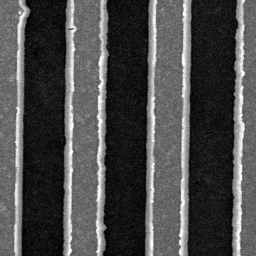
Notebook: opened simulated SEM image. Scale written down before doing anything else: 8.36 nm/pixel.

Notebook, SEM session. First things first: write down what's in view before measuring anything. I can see one or a few lines or trenches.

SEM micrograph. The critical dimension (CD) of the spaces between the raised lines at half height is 403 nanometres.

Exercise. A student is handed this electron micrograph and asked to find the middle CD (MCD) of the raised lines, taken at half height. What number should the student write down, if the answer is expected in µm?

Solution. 0.294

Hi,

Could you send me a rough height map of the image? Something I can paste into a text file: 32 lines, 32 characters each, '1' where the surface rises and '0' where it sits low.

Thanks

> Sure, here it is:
11100000011110000001111000000011
11100000011110000001111000000011
11100000011110000001111000000011
11100000011110000001111000000011
11100000011110000001111000000011
11100000011110000001111000000011
11100000011110000001111000000011
11100000011110000001111000000011
11100000011110000001111000000011
11100000011110000001111000000011
11100000011110000001111000000011
11100000011110000001111000000011
11100000011110000001111000000011
11100000011110000001111000000011
11100000111110000001111000000011
11000000111110000001111000000011
11000000011110000001111000000011
11000000011110000001111000000011
11000000011110000001111000000011
11000000011110000001111000000011
11000000111110000001111000000011
11000000111110000001111000000011
11000000111110000001111000000011
11000000111110000001111000000111
11000000111110000001111000000011
11000000111110000001111000000011
11000000111110000001111000000011
11000000111110000001111000000111
11000000111110000001111000000111
11000000111110000001111000000111
11000000111110000001111000000111
11000000111110000001111000000111